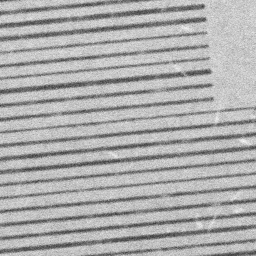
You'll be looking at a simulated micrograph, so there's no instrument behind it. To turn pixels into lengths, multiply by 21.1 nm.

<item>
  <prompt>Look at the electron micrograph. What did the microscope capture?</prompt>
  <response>parallel lines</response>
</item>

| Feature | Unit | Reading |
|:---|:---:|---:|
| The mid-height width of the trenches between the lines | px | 4.23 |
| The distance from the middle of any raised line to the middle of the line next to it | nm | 278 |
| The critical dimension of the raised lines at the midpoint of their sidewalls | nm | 189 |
